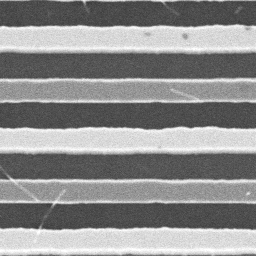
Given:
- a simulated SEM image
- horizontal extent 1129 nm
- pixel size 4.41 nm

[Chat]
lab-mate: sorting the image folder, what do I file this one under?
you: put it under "lines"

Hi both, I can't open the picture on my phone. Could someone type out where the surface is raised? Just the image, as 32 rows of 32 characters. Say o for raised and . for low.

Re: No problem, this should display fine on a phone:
................................
................................
................................
oooooooooooooooooooooooooooooooo
oooooooooooooooooooooooooooooooo
oooooooooooooooooooooooooooooooo
................................
................................
................................
................................
oooooooooooooooooooooooooooooooo
oooooooooooooooooooooooooooooooo
oooooooooooooooooooooooooooooooo
................................
................................
................................
oooooooooooooooooooooooooooooooo
oooooooooooooooooooooooooooooooo
oooooooooooooooooooooooooooooooo
................................
................................
................................
oooo..oo.o..oo..oooo....oo....o.
oooooooooooooooooooooooooooooooo
oooooooooooooooooooooooooooooooo
................................
................................
................................
....................o...........
oooooooooooooooooooooooooooooooo
oooooooooooooooooooooooooooooooo
oooooooooooooooooooooooooooooooo